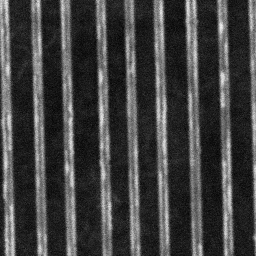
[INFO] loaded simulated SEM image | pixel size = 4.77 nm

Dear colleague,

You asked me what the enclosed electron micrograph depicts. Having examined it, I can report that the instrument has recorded parallel lines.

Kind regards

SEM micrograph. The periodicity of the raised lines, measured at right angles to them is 149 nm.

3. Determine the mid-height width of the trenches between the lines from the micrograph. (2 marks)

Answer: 109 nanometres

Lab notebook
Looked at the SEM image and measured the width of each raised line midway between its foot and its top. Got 39.3 nm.